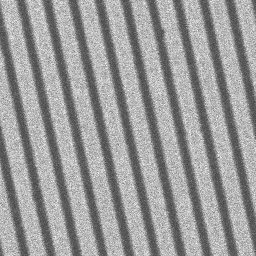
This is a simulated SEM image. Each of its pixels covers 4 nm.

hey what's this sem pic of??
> parallel lines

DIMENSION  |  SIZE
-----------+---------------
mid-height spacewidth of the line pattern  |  42 nm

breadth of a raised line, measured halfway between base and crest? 15.2 pixels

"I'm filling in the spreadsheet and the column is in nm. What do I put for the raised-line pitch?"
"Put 102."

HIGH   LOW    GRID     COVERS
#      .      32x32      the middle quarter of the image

.####..####...###...####...####.
.####...###...####..####...####.
.####...####..####...####..####.
.####...####..####...####..####.
..###...####...###...####...####
..####..####...####..####...####
..####...###...####...###...####
..####...####..####...####..####
...###...####..####...####...###
...####..####...###...####...###
...####...###...####..####...###
...####...####..####...###...###
#..####...####..####...####..###
#...###...####...###...####...##
#...####..####...####..####...##
#...####...###...####...###...##
##..####...####..####...####..##
##...###...####..####...####...#
##...####..####...###...####...#
##...####..####...####..####...#
##...####...####..####...###...#
###..####...####..####...####..#
###...###...####...###...####...
###...####..####...####..####...
###...####...###...####...###...
####..####...####..####...####..
####..####...####..####...####..
####...####..####...###...####..
####...####...###...####..####..
.###...####...####..####...###..
.####..####...####..####...####.
.####...###...####...###...####.